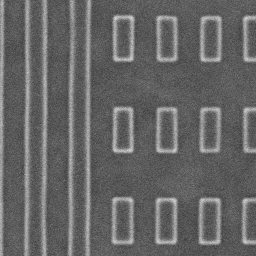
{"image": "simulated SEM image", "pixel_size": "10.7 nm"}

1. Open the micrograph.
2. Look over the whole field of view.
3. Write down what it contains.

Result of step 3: wiring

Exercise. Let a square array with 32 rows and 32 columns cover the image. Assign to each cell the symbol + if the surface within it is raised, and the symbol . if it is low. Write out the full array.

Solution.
...+++...++.....................
...+++...++.....................
...+++...++...+++...++...+++...+
...+++...++...+++...++...+++...+
...+++...++...+++...++...+++...+
...+++...++...+++...++...+++...+
...+++...++...+++...++...+++...+
...+++...++....+....++...++....+
...+++...++.....................
...+++...++.....................
...+++...++.....................
...+++...++.....................
...+++...++.....................
...+++...++....+................
...+++...++...++....++...++....+
...+++...++...++....++...++....+
...+++...++...++....++...++....+
...+++...++...+++...++...++....+
...+++...++...+++...++...++....+
...+++...++.....................
...+++...++.....................
...+++...++.....................
...+++...++.....................
...+++...++.....................
...+++...++.....................
...+++...++...+++...++...++...++
...+++...++...+++...++...++...++
...+++...++...+++...++...++...++
...+++...++...+++...++...++...++
...+++...++...+++...++...++...++
...+++...++.....................
...+++...++.....................